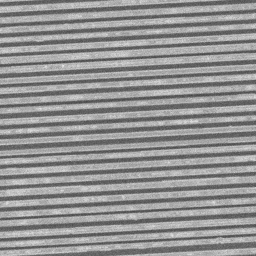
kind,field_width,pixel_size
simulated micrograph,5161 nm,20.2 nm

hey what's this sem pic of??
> parallel lines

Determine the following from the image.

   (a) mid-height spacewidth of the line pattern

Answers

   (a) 98.1 nm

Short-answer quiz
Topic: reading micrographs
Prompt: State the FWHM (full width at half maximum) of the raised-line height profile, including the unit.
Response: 0.0981 micrometres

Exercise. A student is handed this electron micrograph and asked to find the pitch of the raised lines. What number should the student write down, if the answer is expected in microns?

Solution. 0.204